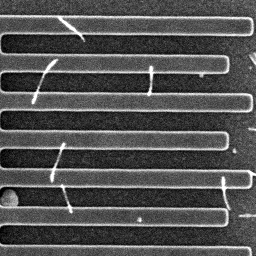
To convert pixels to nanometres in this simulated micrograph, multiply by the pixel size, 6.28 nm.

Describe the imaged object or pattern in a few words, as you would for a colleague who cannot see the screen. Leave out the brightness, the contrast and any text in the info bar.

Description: groups of lines, slits or small figures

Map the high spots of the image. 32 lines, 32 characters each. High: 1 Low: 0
00000000000000000000000000000000
00000000000000000000000000000000
11111111111111111111111111111110
11111111111111111111111111111111
00000000000000000000000000000000
00000000000000000000000000000000
00000000000000000000000000000000
11111111111111111111111111111000
11111111111111111111111111111000
00000000000000000000000000000000
00000000000000000000000000000000
10000000000000000010000000000000
11111111111111111111111111111111
11111111111111111111111111111110
00000000000000000000000000000000
00000000000000000000000000000000
11111111111111111111000000000000
11111111111111111111111111111000
11111111111111111111111111110000
00000000000000000000000000000000
00000000000000000000000000000000
11111111111111111111111111111110
11111111111111111111111111111110
00000000000000000000000000011000
00000000000000000000000000000000
11000000000000000000000000000000
11111111111111111111111111110000
11111111111111111111111111110000
00000000000000000000000000000000
00000000000000000000000000000000
00000000000000000000000000000000
11111111111111111111111111111110